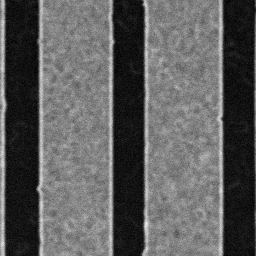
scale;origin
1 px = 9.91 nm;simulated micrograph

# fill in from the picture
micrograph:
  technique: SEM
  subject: one or a few lines or trenches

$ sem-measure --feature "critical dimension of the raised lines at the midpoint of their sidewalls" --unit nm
722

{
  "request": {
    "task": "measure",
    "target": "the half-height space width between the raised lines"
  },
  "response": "0.353 µm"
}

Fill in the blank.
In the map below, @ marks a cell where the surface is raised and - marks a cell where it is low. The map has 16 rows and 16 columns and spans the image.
---@@@@--@@@@@--
---@@@@--@@@@@--
--@@@@@--@@@@@--
---@@@@--@@@@@--
---@@@@--@@@@@--
---@@@@--@@@@@--
---@@@@--@@@@@--
---@@@@--@@@@@--
---@@@@--@@@@@--
---@@@@--@@@@@--
---@@@@--@@@@@--
---@@@@--@@@@@--
---@@@@--@@@@@--
---@@@@--@@@@@--
---@@@@--@@@@@--
---@@@@--@@@@@--